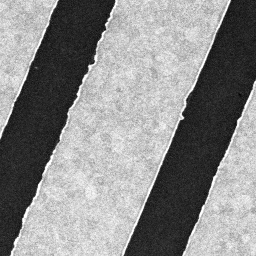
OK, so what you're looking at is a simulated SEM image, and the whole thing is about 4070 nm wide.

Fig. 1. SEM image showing one or a few lines or trenches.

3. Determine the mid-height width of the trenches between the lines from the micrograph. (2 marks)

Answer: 0.883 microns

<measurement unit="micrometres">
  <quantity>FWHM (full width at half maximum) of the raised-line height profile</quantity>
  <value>1.64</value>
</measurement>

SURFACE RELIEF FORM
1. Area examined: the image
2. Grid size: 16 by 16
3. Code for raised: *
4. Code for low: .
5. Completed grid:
***....*******..
***....*******..
***...*******...
**....*******...
**....******....
*....*******....
*....*******...*
....*******....*
....*******....*
...*******....**
...*******....**
..********...***
..*******....***
..*******....***
.*******....****
.*******....****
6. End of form